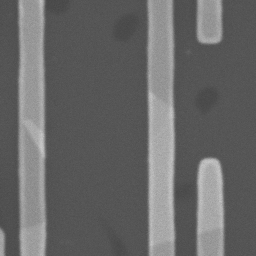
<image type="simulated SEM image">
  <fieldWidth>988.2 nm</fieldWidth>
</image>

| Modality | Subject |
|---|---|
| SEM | wiring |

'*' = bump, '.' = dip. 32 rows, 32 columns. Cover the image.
..***..............***...***....
..***..............***...***....
..***..............***...***....
..***..............***...***....
...**..............***...***....
...**..............***..........
...**..............***..........
...**..............***..........
...**..............***..........
..***..............***..........
..***..............***..........
..***..............***..........
..***..............***..........
..***..............***..........
..***..............***..........
..***..............***..........
..***..............***..........
..***..............***..........
..***..............***..........
..****.............***..........
..****.............***...**.....
..****.............***...***....
...***.............***...***....
...***.............***...***....
...***.............***...***....
...***.............***...***....
...***.............***...***....
...***.............***...***....
...***.............***...***....
...***.............***...***....
...***.............***...***....
...***.............***...***....